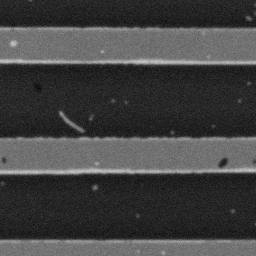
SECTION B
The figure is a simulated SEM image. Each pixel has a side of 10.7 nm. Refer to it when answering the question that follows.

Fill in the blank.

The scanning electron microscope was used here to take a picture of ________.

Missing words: lines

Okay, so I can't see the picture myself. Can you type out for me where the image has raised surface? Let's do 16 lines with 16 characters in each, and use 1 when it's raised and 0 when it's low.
0000000000000000
0000000000000000
1111111111111111
1111111111111111
0000000000000000
0000000000000000
0000000000000000
0000000000000000
0000000000000000
1111111111111111
1111111111111111
0000000000000000
0000000000000000
0000000000000000
0000000000000000
1111111111111111